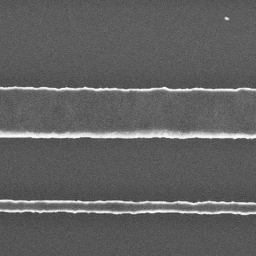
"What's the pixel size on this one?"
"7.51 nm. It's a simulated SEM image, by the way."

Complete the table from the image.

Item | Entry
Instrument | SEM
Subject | lines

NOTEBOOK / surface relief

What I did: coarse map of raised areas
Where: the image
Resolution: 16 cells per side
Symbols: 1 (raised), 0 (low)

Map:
0000000000000000
0000000000000000
0000000000000000
0000000000000000
0000000000000000
1110010000000000
1111111111111111
1111111111111111
0011111110011111
0000000000000000
0000000000000000
0000000000000000
0000000000000000
0000000000000000
0000000000000000
0000000000000000